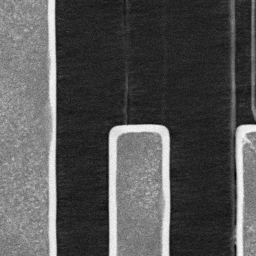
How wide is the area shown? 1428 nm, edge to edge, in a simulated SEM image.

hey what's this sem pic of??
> wiring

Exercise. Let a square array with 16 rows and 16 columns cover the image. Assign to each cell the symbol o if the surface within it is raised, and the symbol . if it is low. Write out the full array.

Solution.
ooo.............
ooo.............
ooo.............
ooo.............
ooo.............
ooo.............
ooo.............
ooo.............
ooo....ooo.....o
ooo....ooo.....o
ooo....ooo.....o
ooo....ooo.....o
ooo....ooo.....o
ooo....ooo.....o
ooo....ooo.....o
ooo....ooo.....o